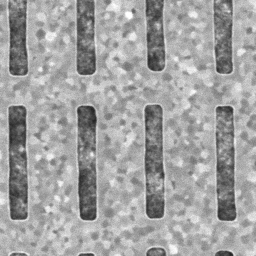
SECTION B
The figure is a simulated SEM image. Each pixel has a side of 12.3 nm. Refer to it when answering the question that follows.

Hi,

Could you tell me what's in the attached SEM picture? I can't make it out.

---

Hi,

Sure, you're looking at holes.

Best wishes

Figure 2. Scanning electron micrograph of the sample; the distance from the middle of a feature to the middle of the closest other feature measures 836 nanometres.